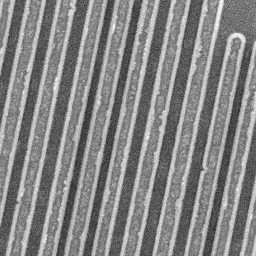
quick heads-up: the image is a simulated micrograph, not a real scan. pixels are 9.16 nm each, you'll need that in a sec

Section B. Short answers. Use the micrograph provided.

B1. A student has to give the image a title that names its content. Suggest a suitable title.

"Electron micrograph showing parallel lines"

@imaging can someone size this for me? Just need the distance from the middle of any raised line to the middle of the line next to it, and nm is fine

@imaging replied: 264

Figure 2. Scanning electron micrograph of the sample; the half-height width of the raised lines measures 0.134 µm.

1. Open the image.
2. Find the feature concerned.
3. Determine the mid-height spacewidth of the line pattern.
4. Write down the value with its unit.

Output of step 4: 134 nanometres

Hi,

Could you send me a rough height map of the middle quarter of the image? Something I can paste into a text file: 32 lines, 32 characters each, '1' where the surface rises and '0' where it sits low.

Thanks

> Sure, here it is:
00011110001111000111000011110000
00011110001111000111000011110000
00011110011110001111000011100000
00011110011110001111000111100001
00011110011110001110000111100001
00111100011110001110000111100001
00111100011110001110000111100001
00111100111100011110000111000001
00111000111100011110001111000001
00111000111100011100001111000011
01111000111100011100001111000011
01111000111100011100001111000011
01111001111000111100001110000111
01110001111000111100011110000111
01110001111000111000011110000111
11110001111000111000011110000111
11110001111000111000011110000111
11110011110001111000011100001111
11100011110001111000111100001111
11100011110001110000111100001111
11100011110001110000111100001111
11100011110001110000111100001111
11100111100011110000111000011111
11000111100011110001111000011111
11000111100011100001111000011110
11000111100011100001111000011110
11000111000111100001111000011110
11001111000111100001110000111110
11001111000111100011110000111100
10001111000111000011110000111100
10001111000111000011110000111100
10001110000111000011110000111100